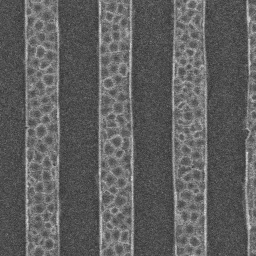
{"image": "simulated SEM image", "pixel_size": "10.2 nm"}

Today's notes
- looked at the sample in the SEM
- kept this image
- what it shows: one or a few lines or trenches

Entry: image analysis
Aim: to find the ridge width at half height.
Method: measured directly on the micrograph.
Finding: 32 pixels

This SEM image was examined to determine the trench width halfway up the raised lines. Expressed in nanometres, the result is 422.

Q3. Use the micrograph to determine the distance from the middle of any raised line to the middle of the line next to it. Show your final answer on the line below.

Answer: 749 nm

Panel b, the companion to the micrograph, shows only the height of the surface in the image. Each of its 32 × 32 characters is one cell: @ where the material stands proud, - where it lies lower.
---@@@@-----@@@@------@@@------@
---@@@@-----@@@@------@@@------@
---@@@@-----@@@@------@@@------@
---@@@@-----@@@@------@@@------@
---@@@@-----@@@@------@@@------@
---@@@@-----@@@@------@@@@-----@
---@@@@-----@@@@------@@@@-----@
---@@@@------@@@------@@@@-----@
---@@@@------@@@------@@@@-----@
---@@@@------@@@------@@@@-----@
---@@@@------@@@------@@@@-----@
---@@@@------@@@------@@@@-----@
---@@@@-----@@@@------@@@@-----@
---@@@@-----@@@@------@@@@-----@
---@@@@-----@@@@------@@@@-----@
---@@@@-----@@@@------@@@@-----@
---@@@@------@@@------@@@@-----@
---@@@@------@@@@-----@@@@-----@
---@@@@------@@@@-----@@@@-----@
---@@@@------@@@@-----@@@@-----@
---@@@@------@@@@-----@@@@-----@
---@@@@-----@@@@@-----@@@@-----@
---@@@@------@@@@-----@@@@-----@
---@@@@------@@@@-----@@@@-----@
---@@@@------@@@@-----@@@@-----@
---@@@@------@@@@-----@@@@-----@
---@@@@------@@@@-----@@@@-----@
---@@@@------@@@@-----@@@@-----@
---@@@@------@@@@-----@@@@-----@
---@@@@------@@@------@@@@-----@
---@@@@------@@@------@@@@-----@
---@@@@------@@@------@@@@-----@